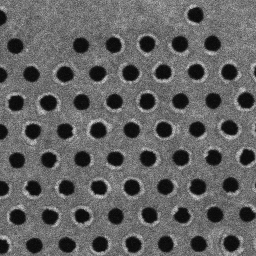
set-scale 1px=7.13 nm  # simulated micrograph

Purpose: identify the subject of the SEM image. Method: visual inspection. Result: a regular array of holes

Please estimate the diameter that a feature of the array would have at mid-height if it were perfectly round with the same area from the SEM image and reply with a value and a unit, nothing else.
15.2 pixels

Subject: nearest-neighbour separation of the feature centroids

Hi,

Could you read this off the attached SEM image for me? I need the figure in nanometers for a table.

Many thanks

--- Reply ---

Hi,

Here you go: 232